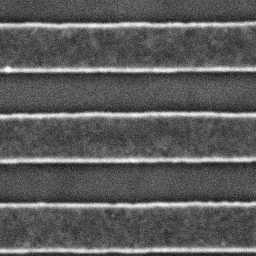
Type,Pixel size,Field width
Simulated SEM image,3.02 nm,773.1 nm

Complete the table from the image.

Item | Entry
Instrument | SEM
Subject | lines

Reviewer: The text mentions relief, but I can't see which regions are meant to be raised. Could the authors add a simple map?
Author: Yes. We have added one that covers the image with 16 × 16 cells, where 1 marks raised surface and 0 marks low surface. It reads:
0000000000000000
0010000111111111
1111111111111111
1111111111111111
1000000000000000
0000000000000000
0000000000000000
1111111111111111
1111111111111111
1111111111111111
0000000000000000
0000000000000000
0000000000000000
1111111111111111
1111111111111111
1111111111111111